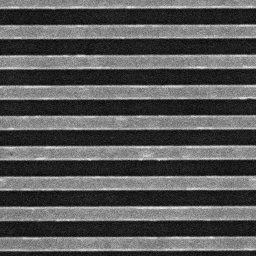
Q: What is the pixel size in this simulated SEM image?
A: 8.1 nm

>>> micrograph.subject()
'parallel lines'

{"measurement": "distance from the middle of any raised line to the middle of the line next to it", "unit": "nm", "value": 245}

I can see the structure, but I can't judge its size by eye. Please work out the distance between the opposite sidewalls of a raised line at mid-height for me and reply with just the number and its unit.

13.1 pixels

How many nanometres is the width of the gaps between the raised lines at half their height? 142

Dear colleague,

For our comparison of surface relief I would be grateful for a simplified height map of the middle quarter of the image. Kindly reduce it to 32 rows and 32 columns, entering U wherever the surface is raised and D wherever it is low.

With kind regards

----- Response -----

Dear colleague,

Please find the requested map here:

UUUUUUUUUUUUUUUUUUUUUUUUUUUUUUUU
DDDDDDDDDDDDDDDDDDDDDDDDDDDDDDDD
DDDDDDDDDDDDDDDDDDDDDDDDDDDDDDDD
DDDDDDDDDDDDDDDDDDDDDDDDDDDDDDDD
DDDDDDDDDDDDDDDDDDDDDDDDDDDDDDDD
DDDDDDDDDDDDDDDDDDUUUUUUDUUUUUUU
UUUUUUUUUUUUUUUUUUUUUUUUUUUUUUUU
UUUUUUUUUUUUUUUUUUUUUUUUUUUUUUUU
UUUUUUUUUUUUUUUUUUUUUUUUUUUUUUUU
DDDDDDDDDDDDDDDDDDDDDDDDDDDDDDDD
DDDDDDDDDDDDDDDDDDDDDDDDDDDDDDDD
DDDDDDDDDDDDDDDDDDDDDDDDDDDDDDDD
DDDDDDDDDDDDDDDDDDDDDDDDDDDDDDDD
UUUUUUUUUUUUUUUUUUUUUUUUUUUUUUUU
UUUUUUUUUUUUUUUUUUUUUUUUUUUUUUUU
UUUUUUUUUUUUUUUUUUUUUUUUUUUUUUUU
DDDDDDDDDDDDDDDDDDDDDDDDDDDDDDDD
DDDDDDDDDDDDDDDDDDDDDDDDDDDDDDDD
DDDDDDDDDDDDDDDDDDDDDDDDDDDDDDDD
DDDDDDDDDDDDDDDDDDDDDDDDDDDDDDDD
DDDDDDDDDDDDDDDDDDDDDDDDDDDDDDDD
UUUUUUUUUUUUUUUUUUUUUUUUUUUUUUUU
UUUUUUUUUUUUUUUUUUUUUUUUUUUUUUUU
UUUUUUUUUUUUUUUUUUUUUUUUUUUUUUUU
DDDDDDDDDDDDDDDDDDDDDDDDDDDDDDDD
DDDDDDDDDDDDDDDDDDDDDDDDDDDDDDDD
DDDDDDDDDDDDDDDDDDDDDDDDDDDDDDDD
DDDDDDDDDDDDDDDDDDDDDDDDDDDDDDDD
UUUUUUUUUUUUUUUUUUUUUUUUUUUUUUUU
UUUUUUUUUUUUUUUUUUUUUUUUUUUUUUUU
UUUUUUUUUUUUUUUUUUUUUUUUUUUUUUUU
DDDDDDDDDDDDDDDDDDDDDDDDDDDDDDDD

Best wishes